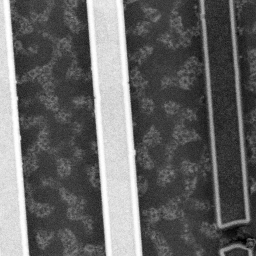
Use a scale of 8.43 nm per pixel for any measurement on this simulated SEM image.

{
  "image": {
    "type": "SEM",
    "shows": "one or a few lines or trenches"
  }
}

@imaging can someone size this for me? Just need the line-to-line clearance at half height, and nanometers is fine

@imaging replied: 707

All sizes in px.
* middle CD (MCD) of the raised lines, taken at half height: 28.3